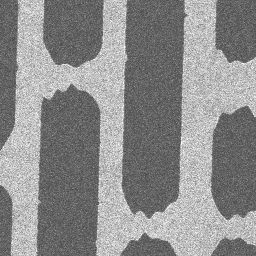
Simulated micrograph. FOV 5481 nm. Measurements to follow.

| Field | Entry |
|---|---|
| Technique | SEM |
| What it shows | one or a few lines or trenches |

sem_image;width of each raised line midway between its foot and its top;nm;1280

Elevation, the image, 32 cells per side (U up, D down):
UUDDDUUUUUUUUDDDUUUUUUUDDDDUUUUU
UUDDDUUUUUUUUDDDUUUUUUUDDDDUUUUU
UUDDDUUUUUUUUDDDUUUUUUUDDDDUUUUU
UUDDDUUUUUUUUDDDUUUUUUUDDDDUUUUU
UUDDDUUUUUUUUDDDUUUUUUUDDDDUUUUU
UUDDDUUUUUUUUDDDUUUUUUUDDDDUUUUU
UUDDDDUUUUUUUDDDUUUUUUUDDDDDUUUU
UUDDDDUUUUUUDDDDUUUUUUUDDDDDUUUU
UUDDDDDDDDDDDDDDUUUUUUUDDDDDDDDD
UUDDDDDDDDDDDDDUUUUUUUUDDDDDDDDD
UUDDDDDDDDDDDDDUUUUUUUUDDDDDDDDD
UUDDDDDUUUUDDDDUUUUUUUUDDDDDDDDD
UUDDDUUUUUUUDDDUUUUUUUUDDDDDDDDD
UUDDDUUUUUUUUDDUUUUUUUUDDDDDDDUD
UUDDDUUUUUUUUDDUUUUUUUUDDDDUUUUU
UUDDDUUUUUUUUDDUUUUUUUUDDDDUUUUU
UUDDDUUUUUUUUDDUUUUUUUUDDDDUUUUU
UDDDDUUUUUUUUDDUUUUUUUUDDDUUUUUU
DDDDDUUUUUUUUDDUUUUUUUUDDDDUUUUU
DDDDDUUUUUUUDDDUUUUUUUUDDDUUUUUU
DDDDDUUUUUUUDDDUUUUUUUUDDDUUUUUU
DDDDDUUUUUUUDDDUUUUUUUUDDDUUUUUU
DDDDDUUUUUUUDDDUUUUUUUUDDDUUUUUU
UDDDDUUUUUUUDDDUUUUUUUDDDDUUUUUU
UDDDDUUUUUUUDDDUUUUUUUDDDDUUUUUU
UUDDDUUUUUUUDDDDUUUUUUDDDDDUUUUU
UUDDDUUUUUUUDDDDUUUUDDDDDDDUUUUU
UUDDDUUUUUUUDDDDDDDDDDDDDDDDUDDD
UUDDDUUUUUUUDDDDDDDDDDDDDDDDDDDD
UUDDDUUUUUUUDDDDDDUDDDDDDDDDDDDD
UDDDDUUUUUUUDDDDUUUUUDDDDDDUUUUD
UDDDDUUUUUUUDDDUUUUUUUDDDDDUUUUU